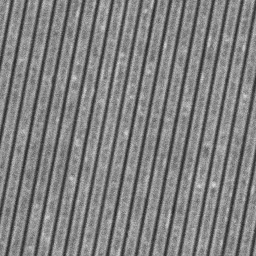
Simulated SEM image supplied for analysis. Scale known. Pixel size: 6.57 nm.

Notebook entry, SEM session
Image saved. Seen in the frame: parallel lines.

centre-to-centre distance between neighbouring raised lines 0.0928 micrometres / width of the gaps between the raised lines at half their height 28.3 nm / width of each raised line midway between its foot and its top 0.067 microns